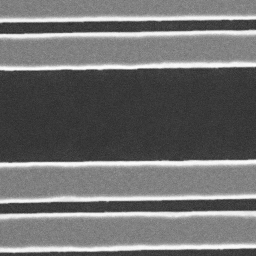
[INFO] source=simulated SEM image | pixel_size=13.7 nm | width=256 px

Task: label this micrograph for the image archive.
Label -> lines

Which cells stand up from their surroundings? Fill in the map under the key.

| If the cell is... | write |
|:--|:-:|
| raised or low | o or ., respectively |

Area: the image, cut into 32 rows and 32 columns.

oooooooooooooooooooooooooooooooo
oooooooooooooooooooooooooooooooo
oooooooo........................
................................
oooooooooooooooooooooooooooooooo
oooooooooooooooooooooooooooooooo
oooooooooooooooooooooooooooooooo
oooooooooooooooooooooooooooooooo
oooooooo.oo.....................
................................
................................
................................
................................
................................
................................
................................
................................
................................
................................
................................
...ooooooooooooooooooooooooooooo
oooooooooooooooooooooooooooooooo
oooooooooooooooooooooooooooooooo
oooooooooooooooooooooooooooooooo
oooooooooooooooooooooooooooooooo
................................
................................
oooooooooooooooooooooooooooooooo
oooooooooooooooooooooooooooooooo
oooooooooooooooooooooooooooooooo
oooooooooooooooooooooooooooooooo
................................